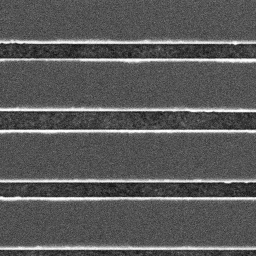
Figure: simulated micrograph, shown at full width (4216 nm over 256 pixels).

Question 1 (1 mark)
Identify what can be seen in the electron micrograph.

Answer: lines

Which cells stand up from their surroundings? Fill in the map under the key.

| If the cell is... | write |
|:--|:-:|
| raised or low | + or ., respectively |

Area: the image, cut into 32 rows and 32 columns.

++++++++++++++++++++++++++++++++
++++++++++++++++++++++++++++++++
++++++++++++++++++++++++++++++++
++++++++++++++++++++++++++++++++
++++++++++++++++++++++++++++++++
................................
................................
++++++++++++++++..++++++++......
++++++++++++++++++++++++++++++++
++++++++++++++++++++++++++++++++
++++++++++++++++++++++++++++++++
++++++++++++++++++++++++++++++++
++++++++++++++++++++++++++++++++
++++++++++++++++++++++++++++++++
................................
................................
++++++++++++++++++++++++++++++++
++++++++++++++++++++++++++++++++
++++++++++++++++++++++++++++++++
++++++++++++++++++++++++++++++++
++++++++++++++++++++++++++++++++
++++++++++++++++++++++++++++++++
++++++++++++++++++++++++++++++++
................................
................................
++++++++++++++++++++++++++++++++
++++++++++++++++++++++++++++++++
++++++++++++++++++++++++++++++++
++++++++++++++++++++++++++++++++
++++++++++++++++++++++++++++++++
++++++++++++++++++++++++++++++++
................................